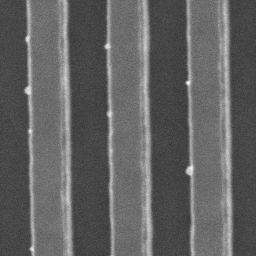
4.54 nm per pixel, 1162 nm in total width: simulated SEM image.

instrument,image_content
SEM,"lines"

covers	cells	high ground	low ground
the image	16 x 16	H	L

LLHHLLLHHLLLHHLL
LLHHLLLHHLLLHHLL
LLHHLLLHHLLLHHLL
LLHHLLLHHLLLHHLL
LLHHLLLHHLLLHHLL
LLHHLLLHHLLLHHLL
LLHHLLLHHLLLHHLL
LLHHLLLHHLLLHHLL
LLHHLLLHHLLLHHLL
LLHHLLLHHLLLHHLL
LLHHLLLHHLLLHHLL
LLHHLLLHHLLLHHLL
LLHHLLLHHLLLHHLL
LLHHLLLHHLLLHHLL
LLHHLLLHHLLLHHLL
LLHHLLLHHLLLHHLL